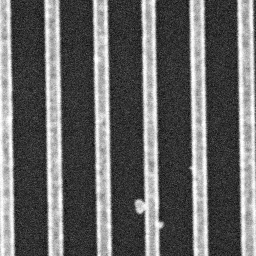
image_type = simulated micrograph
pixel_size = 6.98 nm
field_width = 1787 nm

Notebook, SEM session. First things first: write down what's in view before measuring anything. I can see parallel lines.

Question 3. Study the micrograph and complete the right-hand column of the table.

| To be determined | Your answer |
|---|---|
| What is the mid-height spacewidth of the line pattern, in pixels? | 37.2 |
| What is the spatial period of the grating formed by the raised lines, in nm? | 338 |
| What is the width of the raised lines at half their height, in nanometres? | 80.2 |